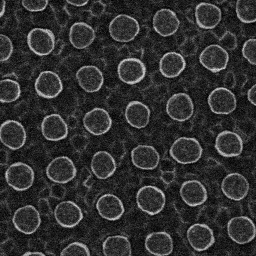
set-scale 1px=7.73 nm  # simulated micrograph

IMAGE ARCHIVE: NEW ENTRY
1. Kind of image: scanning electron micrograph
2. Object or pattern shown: a regular array of raised bodies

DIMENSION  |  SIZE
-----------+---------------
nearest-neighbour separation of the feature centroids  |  41.8 px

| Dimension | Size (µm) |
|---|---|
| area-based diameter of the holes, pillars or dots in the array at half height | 0.203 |